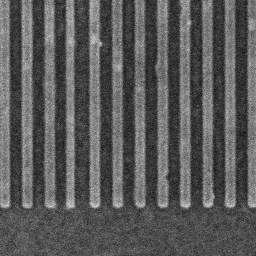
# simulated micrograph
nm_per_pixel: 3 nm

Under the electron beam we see parallel lines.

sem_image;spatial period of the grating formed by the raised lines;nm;67.7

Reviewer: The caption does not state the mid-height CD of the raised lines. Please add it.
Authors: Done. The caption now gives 27.4 nanometres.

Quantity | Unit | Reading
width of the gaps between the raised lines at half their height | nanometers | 37.9